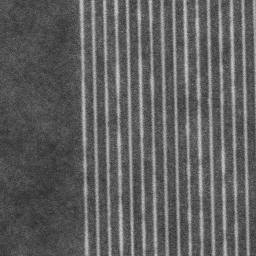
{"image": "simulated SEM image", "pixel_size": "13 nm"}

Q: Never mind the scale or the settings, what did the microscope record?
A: parallel lines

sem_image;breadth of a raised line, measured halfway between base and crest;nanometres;24.4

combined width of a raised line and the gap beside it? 150 nm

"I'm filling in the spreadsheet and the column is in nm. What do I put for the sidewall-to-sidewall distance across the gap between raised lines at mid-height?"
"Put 119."